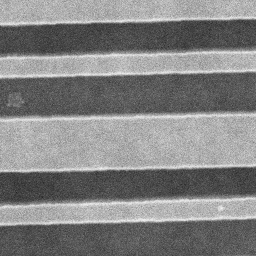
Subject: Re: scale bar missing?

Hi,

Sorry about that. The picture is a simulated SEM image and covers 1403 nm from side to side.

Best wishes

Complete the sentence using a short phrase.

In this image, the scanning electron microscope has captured lines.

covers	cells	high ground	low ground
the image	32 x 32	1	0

11111111111111111111111111111111
11111111111111111111111111111111
11111111111111111111100000000000
00000000000000000000000000000000
00000000000000000000000000000000
00000000000000000000000000000000
00000000000000000000000011111111
11111111111111111111111111111111
11111111111111111111111111111111
11111110000000000000000000000000
00000000000000000000000000000000
00000000000000000000000000000000
00000000000000000000000000000000
00000000000000000000000000000000
00000000000000000001111111111111
11111111111111111111111111111111
11111111111111111111111111111111
11111111111111111111111111111111
11111111111111111111111111111111
11111111111111111111111111111111
11111111111111111111111111111111
00000000000000000000000000000000
00000000000000000000000000000000
00000000000000000000000000000000
00000000000000000000000000000000
00000000001111111111111111111111
11111111111111111111111111111111
11111111111111111111111100000000
00000000000000000000000000000000
00000000000000000000000000000000
00000000000000000000000000000000
00000000000000000000000000000000